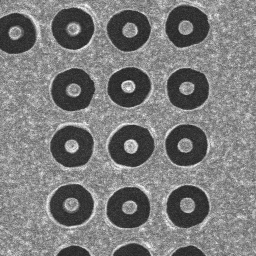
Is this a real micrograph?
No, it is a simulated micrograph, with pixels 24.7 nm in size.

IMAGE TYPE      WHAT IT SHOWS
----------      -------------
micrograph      a regular array of ring-shaped grooves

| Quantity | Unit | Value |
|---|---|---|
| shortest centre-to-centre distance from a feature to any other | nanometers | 1390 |